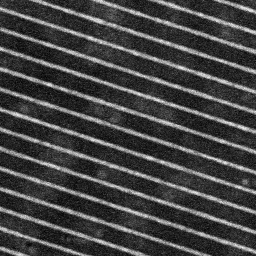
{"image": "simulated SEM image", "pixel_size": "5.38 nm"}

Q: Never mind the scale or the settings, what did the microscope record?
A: parallel lines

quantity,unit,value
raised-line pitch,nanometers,102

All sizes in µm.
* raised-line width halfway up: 0.0128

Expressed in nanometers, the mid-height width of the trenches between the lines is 86.9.